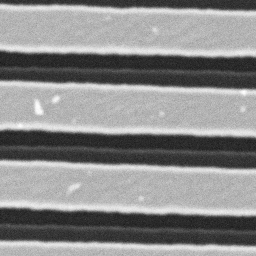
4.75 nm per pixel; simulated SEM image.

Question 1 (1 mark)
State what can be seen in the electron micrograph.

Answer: lines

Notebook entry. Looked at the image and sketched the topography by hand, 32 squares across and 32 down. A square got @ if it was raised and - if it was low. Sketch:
--------------------------------
@@@@@@@@@@@@@@@@@@@@@@@@@@@@@@@@
@@@@@@@@@@@@@@@@@@@@@@@@@@@@@@@@
@@@@@@@@@@@@@@@@@@@@@@@@@@@@@@@@
@@@@@@@@@@@@@@@@@@@@@@@@@@@@@@@@
@@@@@@@@@@@@@@@@@@@@@@@@@@@@@@@@
---@@@@@@@@@@@@@@@@@@@@@@@@@@@@@
--------------------------------
--------------------------------
--------------------------------
@@@@@@@@@@@@@-------------------
@@@@@@@@@@@@@@@@@@@@@@@@@@@@@@@@
@@@@@@@@@@@@@@@@@@@@@@@@@@@@@@@@
@@@@@@@@@@@@@@@@@@@@@@@@@@@@@@@@
@@@@@@@@@@@@@@@@@@@@@@@@@@@@@@@@
@@@@@@@@@@@@@@@@@@@@@@@@@@@@@@@@
---------@@@@@@@@@@@@@@@@@@@@@@@
--------------------------------
--------------------------------
--------------------------------
@@@@@@@@@@@@--------------------
@@@@@@@@@@@@@@@@@@@@@@@@@@@@@@@@
@@@@@@@@@@@@@@@@@@@@@@@@@@@@@@@@
@@@@@@@@@@@@@@@@@@@@@@@@@@@@@@@@
@@@@@@@@@@@@@@@@@@@@@@@@@@@@@@@@
@@@@@@@@@@@@@@@@@@@@@@@@@@@@@@@@
---------------@@@@@@@@@@@@@@@@@
--------------------------------
--------------------------------
--------------------------------
@@@@@@@@@@@@@@@-----------------
@@@@@@@@@@@@@@@@@@@@@@@@@@@@@@@@